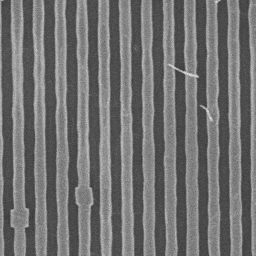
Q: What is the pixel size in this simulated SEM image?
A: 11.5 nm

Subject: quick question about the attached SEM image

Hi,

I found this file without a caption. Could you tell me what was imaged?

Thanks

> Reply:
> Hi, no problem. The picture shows wiring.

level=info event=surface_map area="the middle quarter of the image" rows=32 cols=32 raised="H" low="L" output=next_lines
LLLLHHLLLHHLLLHHHLLLHHLLLHHHLLLH
LLLLHHLLLHHLLLHHHLLLHHLLLHHHLLHH
LLLLHHLLLHHLLLHHHLLLHHLLLHHLLLHH
LLLLHHLLLHHLLLHHHLLLHHLLLHHLLLLH
LLLLHHLLLHHLLLHHHLLLHHLLLHHLLLLH
LLLLHHLLLHHLLLHHHLLLHHLLLHHLLLLH
LLLLHHLLLHHLLLHHHLLLHHLLLHHLLLLH
LLLLHHLLLHHLLLHHHLLLHHLLLHHLLLLH
LLLLHHLLLHHLLLHHHLLLHHLLLHHLLLLH
LLLLHHLLLHHLLLHHHLLLHHLLLHHLLLLH
LLLLHHLLLHHLLLLHHLLLHHLLLHHLLLLH
HLLLHHLLLHHLLLHHHLLLHHLLLHHHLLLH
HLLLHHLLLHHLLLHHHLLLHHLLLHHHLLLH
HLLLHHLLLHHLLLLHHLLLHHLLLHHHLLLH
HLLLHHLLLHHLLLLHHLLLHHLLLHHHLLLH
HLLLHHLLLLHLLLLHHLLLHHLLLHHHLLLH
HLLLHHLLLLHLLLLHHLLLHHLLLHHHLLLH
HLLLHHLLLLHLLLLHHLLLHHLLLHHHLLLH
HLLLHHLLLLHLLLLHHLLLHHLLLHHHLLLH
HLLLHHLLLLHLLLLHHLLLHHLLLHHHLLHH
HLLLHHLLLHHLLLLHHLLLHHLLLHHHLLHH
HLLLHHLLLHHLLLLHHLLLHHLLLHHHLLLH
HLLLHHLLLHHLLLLHHLLLHHHLLHHHLLLH
HLLHHHLLLHHLLLLHHLLLHHHLLHHHLLLH
HLLHHHLLLLHLLLLHHLLLHHHLLHHHLLLH
HLLHHHLLLHHLLLLHHLLLHHLLLHHHLLLH
HLLHHHLLLHHLLLLHHLLLHHLLLHHHLLLH
HLLLHHLLLHHLLLLHHLLLHHHLLHHHLLLH
HLLLHHLLLHHLLLLHHLLLHHHLLHHHLLLH
HLLLHHLLLHHLLLLHHLLLHHLLLHHHLLLH
HLLLHHLLLHHLLLLHHLLLHHLLLHHHLLLH
HLLHHHHLLHHLLLLHHLLLHHLLLHHHLLLH